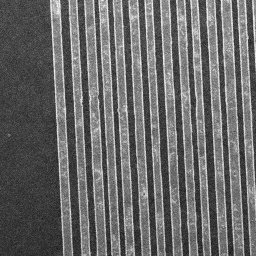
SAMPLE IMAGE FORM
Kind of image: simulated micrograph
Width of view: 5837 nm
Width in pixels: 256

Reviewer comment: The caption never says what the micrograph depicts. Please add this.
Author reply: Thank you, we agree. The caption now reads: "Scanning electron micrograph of parallel lines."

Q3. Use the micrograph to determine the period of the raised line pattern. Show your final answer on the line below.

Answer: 354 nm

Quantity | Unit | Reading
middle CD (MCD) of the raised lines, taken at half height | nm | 179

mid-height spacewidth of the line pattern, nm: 162